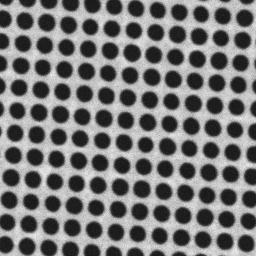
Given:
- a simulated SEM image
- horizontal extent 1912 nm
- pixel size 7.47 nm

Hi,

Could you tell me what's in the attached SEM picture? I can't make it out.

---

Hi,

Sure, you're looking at a regular array of holes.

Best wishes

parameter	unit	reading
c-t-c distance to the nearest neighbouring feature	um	0.162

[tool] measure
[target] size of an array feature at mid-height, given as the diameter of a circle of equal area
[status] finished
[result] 127 nm